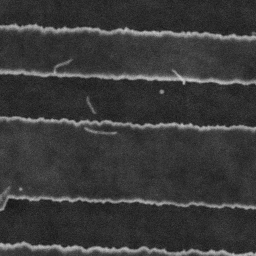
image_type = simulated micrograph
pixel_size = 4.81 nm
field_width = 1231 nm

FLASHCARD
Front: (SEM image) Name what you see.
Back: lines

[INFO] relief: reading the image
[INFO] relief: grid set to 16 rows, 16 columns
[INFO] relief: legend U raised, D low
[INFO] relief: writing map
DDDDDDDDDDDDDDDD
DDDDDDDDDDDDDDDD
UUUUUUUUUUUUUUUU
UUUUUUUUUUUUUUUU
UUUUUUUUUUUUUUUU
DDDDDDDDDDDDDDDD
DDDDDDDDDDDDDDDD
UUUUDDDDDDDDDDDD
UUUUUUUUUUUUUUUU
UUUUUUUUUUUUUUUU
UUUUUUUUUUUUUUUU
UUUUUUUUUUUUUUUU
UDDUUUUUUUUUUUUU
DDDDDDDDDDDDDDDD
DDDDDDDDDDDDDDDD
UUUUUUUDDDDDDDDD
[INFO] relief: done